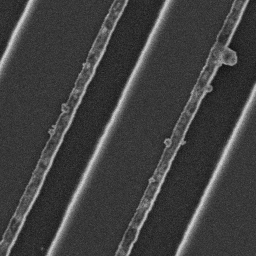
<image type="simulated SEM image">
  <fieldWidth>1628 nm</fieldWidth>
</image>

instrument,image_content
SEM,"lines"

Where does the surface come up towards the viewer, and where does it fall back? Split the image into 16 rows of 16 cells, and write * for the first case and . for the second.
..******..*****.
.******...*****.
.******..*****..
******...******.
******..*****...
*****...*****...
*****..*****....
****...*****...*
****..******...*
***...*****...**
***...*****...**
***..*****...***
**...*****...***
**..*****...****
*...*****...****
*..*****...*****